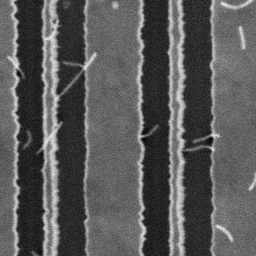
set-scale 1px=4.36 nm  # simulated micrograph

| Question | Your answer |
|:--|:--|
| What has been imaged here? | lines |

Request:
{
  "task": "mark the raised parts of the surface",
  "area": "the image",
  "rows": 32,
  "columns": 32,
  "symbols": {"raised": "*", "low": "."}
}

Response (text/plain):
**....*....*******...**...******
**...**....*******...**...******
**...**....*******...**...******
**...**....*******...**...******
**...**....*******...**...******
**...**....*******...**....*****
**...**....*******...**....*****
**...**....*******...**...******
**...**....*******...**...******
**...**....*******...**...******
**....*....*******...**...******
**...**....*******...**...******
**...**....*******...**....*****
**...**....*******...**...******
**...**....*******...**....*****
**...**....*******...**...******
**...**....*******...**...******
**...**....*******...**....*****
**...**....*******...**...******
**....*....*******...**...******
**....*....*******...**...******
**...**....*******...**...******
**...**....*******...**...******
**...**....*******...**....*****
**...**....*******...**....*****
**...**....*******...**....*****
**....*....*******...**....*****
**...**....*******...**...******
**....*....*******...**....*****
**....*....*******...**....*****
**...**....*******...**...******
**...**....*******...**...******